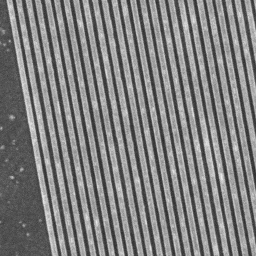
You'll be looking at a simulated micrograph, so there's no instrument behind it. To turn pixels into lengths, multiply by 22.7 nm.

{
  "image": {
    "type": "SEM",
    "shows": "parallel lines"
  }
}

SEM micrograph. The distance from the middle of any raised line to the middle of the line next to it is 213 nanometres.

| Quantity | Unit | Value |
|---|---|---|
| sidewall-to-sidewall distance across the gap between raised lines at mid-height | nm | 92.3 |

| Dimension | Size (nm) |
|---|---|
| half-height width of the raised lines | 112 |